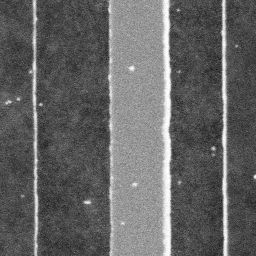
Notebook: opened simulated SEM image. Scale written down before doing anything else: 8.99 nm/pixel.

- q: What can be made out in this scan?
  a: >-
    lines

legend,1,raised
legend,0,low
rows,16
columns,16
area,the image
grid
1100000111000011
1100000111000011
1100000111000011
1100000111000011
1100000111000011
1100000111000011
1100000111000011
1100000111000011
1100000111000011
1100000111000011
1100000111000011
1100000111000011
1100000111000011
1100000111000011
1100000111000011
1100000111000011